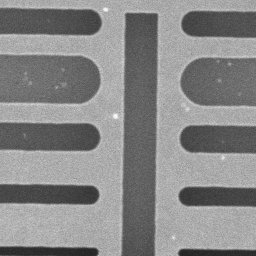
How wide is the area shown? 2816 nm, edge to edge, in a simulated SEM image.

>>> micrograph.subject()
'groups of lines, slits or small figures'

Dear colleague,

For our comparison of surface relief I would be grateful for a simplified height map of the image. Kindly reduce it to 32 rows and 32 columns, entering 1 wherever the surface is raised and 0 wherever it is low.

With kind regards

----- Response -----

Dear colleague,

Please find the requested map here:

11111111111111111111111111111111
00000000000011111111111100000000
00000000000001110000111000000000
00000000000001110000111000000000
11111111111111100000111100000000
11111111111111100000111111111111
11111111111111100000111111111111
00000000000111100000111100000000
00000000000011100000111000000000
00000000000001100000111000000000
00000000000001100000111000000000
00000000000011100000111000000000
00000000000111100000111100000000
11111111111111100000111111111111
11111111111111100000111111111111
00000000000111100000111111111111
00000000000011100000111000000000
00000000000001100000111000000000
00000000000011100000111000000000
11111111111111100000111111111111
11111111111111100000111111111111
11111111111111100000111111111111
11111111111111100000111111111111
00000000000011100000111000000000
00000000000011100000110000000000
00000000000011100000111000000000
11111111111111100001111111111111
11111111111111100001111111111111
11111111111111100001111111111111
11111111111111100001111111111111
11111111111111100001111111111111
00000000000011100001110000000000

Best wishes